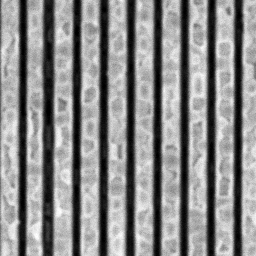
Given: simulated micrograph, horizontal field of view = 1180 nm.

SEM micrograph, parallel lines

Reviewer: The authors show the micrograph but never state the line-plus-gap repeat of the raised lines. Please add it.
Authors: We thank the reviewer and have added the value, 27.1 pixels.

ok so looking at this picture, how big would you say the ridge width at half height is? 86.4 nm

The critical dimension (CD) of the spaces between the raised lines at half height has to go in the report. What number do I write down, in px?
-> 7.98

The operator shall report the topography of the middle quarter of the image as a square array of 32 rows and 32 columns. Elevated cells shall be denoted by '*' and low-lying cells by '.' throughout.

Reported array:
**..*****..*****..****...****..*
**..*****..*****..****...****..*
**..*****..****...****...****..*
**..*****..*****..****...****..*
**..*****..*****..****...****..*
**..*****..*****..****...****..*
**..*****..*****..****...****..*
**..*****..*****..****...****..*
**..*****..*****..****...****..*
**..*****..*****..****...****..*
**..*****..*****..****..*****..*
**..*****..*****..****...****..*
**..*****..*****..****...****..*
**..*****..*****..****..*****..*
**..*****..*****..****..*****..*
**..*****..*****..****..*****..*
**..*****..*****..****...****..*
**..*****..*****..****...****..*
**..*****..*****..****...****..*
**..*****..*****..****...****..*
**..*****..****...****...****..*
**..*****..****...****...****..*
**..*****..****...****...****..*
**..*****..****...****...****..*
**..*****..****...****...****..*
**..*****..****...****...****..*
**..*****..****...****...****..*
**..*****..****...****...****..*
**..*****..****...****...****..*
**..*****..****...****...****..*
**..*****..****...****...****..*
**..*****..****...****...****..*